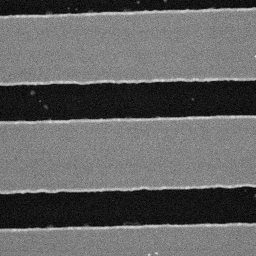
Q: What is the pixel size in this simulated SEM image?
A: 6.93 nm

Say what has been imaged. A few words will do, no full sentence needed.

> lines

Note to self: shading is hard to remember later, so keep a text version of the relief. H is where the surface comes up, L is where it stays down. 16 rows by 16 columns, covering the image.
LLLLLLLLLLLLLLLH
HHHHHHHHHHHHHHHH
HHHHHHHHHHHHHHHH
HHHHHHHHHHHHHHHH
HHHHHHHHHHHHHHHH
LLLLLLLLLLLLLLLL
LLLLLLLLLLLLLLLL
LLLLHHHHHHHHHHHH
HHHHHHHHHHHHHHHH
HHHHHHHHHHHHHHHH
HHHHHHHHHHHHHHHH
HHHHHHHHHHHHHHHH
LLLLLLLLLLLLLLLL
LLLLLLLLLLLLLLLL
HHHHHHHHHHHHHHHH
HHHHHHHHHHHHHHHH